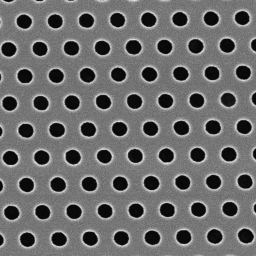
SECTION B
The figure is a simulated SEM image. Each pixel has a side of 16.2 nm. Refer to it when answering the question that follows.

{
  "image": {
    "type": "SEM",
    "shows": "a regular array of holes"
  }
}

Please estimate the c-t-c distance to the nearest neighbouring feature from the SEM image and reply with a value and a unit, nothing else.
503 nanometers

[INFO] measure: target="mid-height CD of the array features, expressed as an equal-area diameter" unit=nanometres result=244